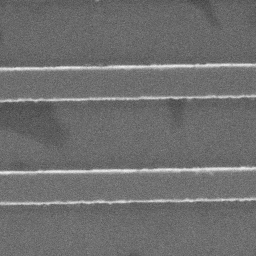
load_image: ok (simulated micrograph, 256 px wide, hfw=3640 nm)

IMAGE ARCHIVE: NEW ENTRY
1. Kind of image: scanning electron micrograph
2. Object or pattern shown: lines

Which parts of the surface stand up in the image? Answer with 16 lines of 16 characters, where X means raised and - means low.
----------------
----------------
----------------
----------------
XXXXXXXXXXXXXXXX
XXXXXXXXXXXXXXXX
----------------
----------------
----------------
----------------
----------------
XXXXXXXXXXXXXXXX
XXXXXXXXXXXXXXXX
----------------
----------------
----------------